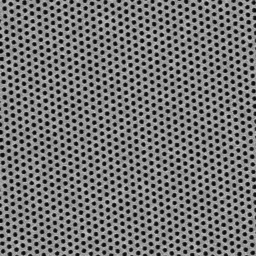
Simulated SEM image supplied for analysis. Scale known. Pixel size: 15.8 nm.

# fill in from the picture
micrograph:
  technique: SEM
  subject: a regular array of holes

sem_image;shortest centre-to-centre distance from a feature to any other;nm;118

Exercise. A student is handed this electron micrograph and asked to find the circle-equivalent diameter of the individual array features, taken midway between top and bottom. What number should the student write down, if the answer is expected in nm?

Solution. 77.8